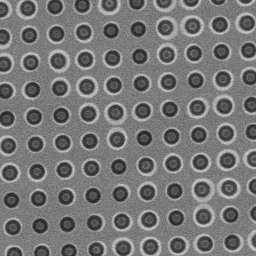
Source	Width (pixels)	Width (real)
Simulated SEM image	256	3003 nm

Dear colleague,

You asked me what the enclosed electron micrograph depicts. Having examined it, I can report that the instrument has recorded an array of small figures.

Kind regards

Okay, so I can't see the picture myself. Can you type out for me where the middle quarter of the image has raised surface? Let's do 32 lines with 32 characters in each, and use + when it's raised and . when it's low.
.+++...++++..+++++++++++++++++++
++++++++++++++++++++++++++++++++
+++++++++++++++++++++++++..+++++
+++++..++++...++++...+++....+++.
.+++....++....+++.....++....+++.
.++.....++.....++....+++....+++.
.+++....+++...++++...++++..+++++
.+++...+++++.+++++++++++++++++++
++++++++++++++++++++++++++++++++
+++++++++++++++++++++++++..+++++
+++++..++++...++++....++....+++.
.+++....+++....++.....++.....++.
.+++....+++....++.....+++...+++.
.+++....+++....+++...+++++++++++
.++++..+++++..++++++++++++++++++
++++++++++++++++++++++++++++++++
++++++++++++..++++++++++++..++++
+++++...+++....+++....+++....+++
.+++....+++.....++....+++....+++
..++.....++....+++....+++....+++
..+++...++++...+++++++++++++++++
.+++++++++++++++++++++++++++++++
++++++++++++++++++++++++++++++++
+++++++++++++++++++...+++....+++
.++++...++++...+++....+++.....++
..+++....+++....++.....++....+++
..+++....+++....+++....+++...+++
..+++...+++++..+++++..++++++++++
.+++++++++++++++++++++++++++++++
++++++++++++++++++++++++++++++++
+++++++++++++..++++....+++...+++
..++++...+++....+++....+++....++